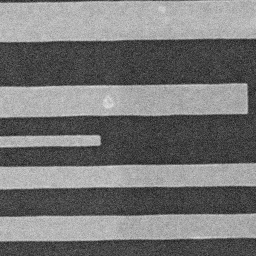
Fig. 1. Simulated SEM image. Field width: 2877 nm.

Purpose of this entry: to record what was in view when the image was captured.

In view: groups of lines, slits or small figures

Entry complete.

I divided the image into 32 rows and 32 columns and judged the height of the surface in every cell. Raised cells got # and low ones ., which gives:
################################
################################
################################
################################
################################
................................
................................
................................
................................
................................
................................
###############################.
###############################.
###############################.
#######.........................
................................
................................
############....................
................................
................................
................................
################################
################################
###.............................
................................
................................
................................
################################
################################
################################
................................
................................